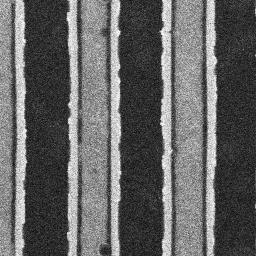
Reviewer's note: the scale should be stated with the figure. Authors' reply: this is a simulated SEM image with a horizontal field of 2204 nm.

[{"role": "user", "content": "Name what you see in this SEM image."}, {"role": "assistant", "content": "one or a few lines or trenches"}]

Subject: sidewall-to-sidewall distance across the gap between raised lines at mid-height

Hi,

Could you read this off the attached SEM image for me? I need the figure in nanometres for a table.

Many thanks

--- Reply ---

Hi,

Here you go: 354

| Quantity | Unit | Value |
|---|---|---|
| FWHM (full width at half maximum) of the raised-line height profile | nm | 465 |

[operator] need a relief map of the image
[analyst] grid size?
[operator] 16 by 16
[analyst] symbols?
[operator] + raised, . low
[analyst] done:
.++++..+++...+++
.++++..+++...+++
.++++..+++...+++
.++++..+++...+++
.++++..+++...+++
.++++..+++...+++
.++++..+++...+++
.++++..+++...+++
.++++..+++...+++
.++++..++++..+++
.++++..+++...+++
.++++..+++...+++
.++++..+++...+++
.++++..+++...+++
.++++..+++...+++
.++++..+++...+++